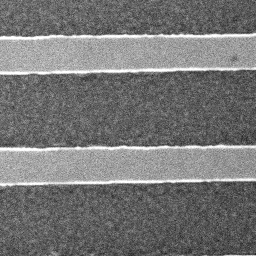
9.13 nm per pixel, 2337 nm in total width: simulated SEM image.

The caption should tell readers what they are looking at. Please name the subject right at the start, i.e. lines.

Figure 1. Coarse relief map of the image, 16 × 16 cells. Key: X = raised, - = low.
----------------
----------------
XXXXXXXXXXXXXXXX
XXXXXXXXXXXXXXXX
XXXXXX----------
----------------
----------------
----------------
----------------
XXXXXXXXXXXXXXXX
XXXXXXXXXXXXXXXX
XXX-------------
----------------
----------------
----------------
----------------